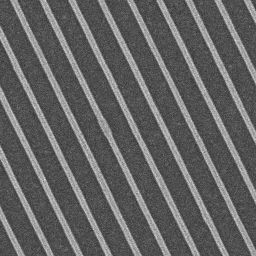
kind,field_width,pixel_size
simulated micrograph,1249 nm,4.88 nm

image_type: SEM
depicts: parallel lines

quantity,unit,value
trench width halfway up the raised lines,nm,104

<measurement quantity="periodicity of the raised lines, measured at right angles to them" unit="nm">128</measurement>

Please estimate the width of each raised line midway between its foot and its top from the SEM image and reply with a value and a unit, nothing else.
25.7 nanometers